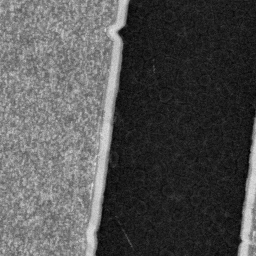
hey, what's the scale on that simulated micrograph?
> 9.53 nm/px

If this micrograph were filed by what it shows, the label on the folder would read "one or a few lines or trenches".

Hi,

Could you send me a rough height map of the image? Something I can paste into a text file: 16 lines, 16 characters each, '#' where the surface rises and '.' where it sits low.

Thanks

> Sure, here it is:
########........
#######.........
#######.........
#######.........
#######.........
#######.........
#######.........
#######.........
#######.........
######..........
######..........
######..........
######..........
######..........
######.........#
######.........#